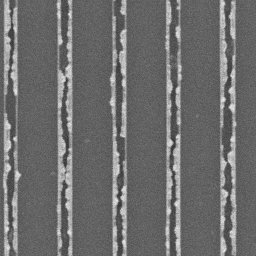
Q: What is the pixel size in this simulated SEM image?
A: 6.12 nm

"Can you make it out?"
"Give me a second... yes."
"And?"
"parallel lines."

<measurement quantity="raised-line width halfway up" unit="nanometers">84.9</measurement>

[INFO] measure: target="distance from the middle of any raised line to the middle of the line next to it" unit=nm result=332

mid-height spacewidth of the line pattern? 40.7 pixels